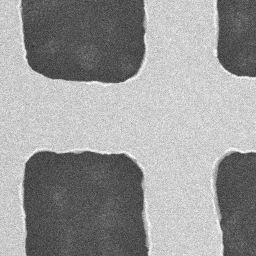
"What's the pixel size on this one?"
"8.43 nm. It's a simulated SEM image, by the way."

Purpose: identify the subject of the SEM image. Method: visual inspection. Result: holes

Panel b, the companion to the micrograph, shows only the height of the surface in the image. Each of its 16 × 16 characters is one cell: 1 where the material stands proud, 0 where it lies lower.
1000000001111100
1000000001111100
1100000001111100
1100000001111100
1100000001111100
1111111111111111
1111111111111111
1111111111111111
1111111111111111
1111001111111111
1100000001111000
1000000001111000
1000000001111100
1100000001111100
1100000001111100
1100000001111100